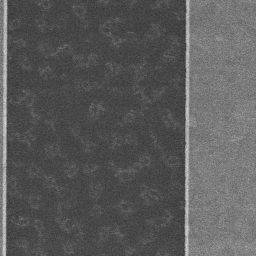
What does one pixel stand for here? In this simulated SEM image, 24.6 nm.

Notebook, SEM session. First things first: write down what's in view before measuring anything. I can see one or a few lines or trenches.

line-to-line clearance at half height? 4490 nanometres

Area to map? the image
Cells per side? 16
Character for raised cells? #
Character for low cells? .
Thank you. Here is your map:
............####
............####
............####
............####
............####
............####
............####
............####
............####
............####
............####
............####
............####
............####
............####
............####